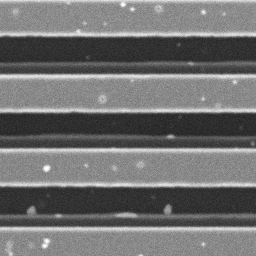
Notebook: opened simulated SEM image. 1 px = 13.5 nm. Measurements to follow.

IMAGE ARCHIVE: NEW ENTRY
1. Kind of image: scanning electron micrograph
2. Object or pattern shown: lines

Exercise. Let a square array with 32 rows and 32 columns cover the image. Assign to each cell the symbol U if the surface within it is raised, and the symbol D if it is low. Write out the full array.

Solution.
UUUUUUUUUUUUUUUUUUUUUUUUUUUUUUUU
UUUUUUUUUUUUUUUUUUUUUUUUUUUUUUUU
UUUUUUUUUUUUUUUUUUUUUUUUUUUUUUUU
UUUUUUUUUUUUUUUUUUUUUUUUUUUUUUUU
DDDDDDDDDDDDDDDDDDDDDDDDDDDDDDDD
DDDDDDDDDDDDDDDDDDDDDDDDDDDDDDDD
DDDDDDDDDDDDDDDDDDDDDDDDDDDDDDDD
DDDDDDDDDDDDDDDDDDDDDDDDDDDDDDDD
DDDDDDDDDDDDDDDDDDDDDDDDDDDDDDDD
UUUUUUUUUUUUUUUUUUUUUUUUUUUUUUUU
UUUUUUUUUUUUUUUUUUUUUUUUUUUUUUUU
UUUUUUUUUUUUUUUUUUUUUUUUUUUUUUUU
UUUUUUUUUUUUUUUUUUUUUUUUUUUUUUUU
UUUUUUUUUUUUUUUUUUUUUUUUUUUUUUUU
DDDDDDDDDDDDDDDDDDDDDDDDDDDDDDDD
DDDDDDDDDDDDDDDDDDDDDDDDDDDDDDDD
DDDDDDDDDDDDDDDDDDDDDDDDDDDDDDDD
DDDDDDDDDDDDDDDDDDDDDDDDDDDDDDDD
DDDDDDDDDDDDDDDDDDDDDDDDDDDDDDDD
UUUUUUUUUUUUUUUUUUUUUUUUUUUUUUUU
UUUUUUUUUUUUUUUUUUUUUUUUUUUUUUUU
UUUUUUUUUUUUUUUUUUUUUUUUUUUUUUUU
UUUUUUUUUUUUUUUUUUUUUUUUUUUUUUUU
DDDDDDDDDDDDDDDDDDDDDDDDDDDDDDDD
DDDDDDDDDDDDDDDDDDDDDDDDDDDDDDDD
DDDDDDDDDDDDDDDDDDDDDDDDDDDDDDDD
DDDDDDDDDDDDDDDDDDDDDDDDDDDDDDDD
DDDDDDDDDDDDDDDDDDDDDDDDDDDDDDDD
UUUUUUUUUUUUUUUUUUUUUUUUUUUUUUUU
UUUUUUUUUUUUUUUUUUUUUUUUUUUUUUUU
UUUUUUUUUUUUUUUUUUUUUUUUUUUUUUUU
UUUUUUUUUUUUUUUUUUUUUUUUUUUUUUUU